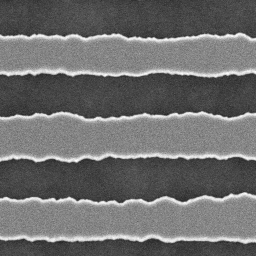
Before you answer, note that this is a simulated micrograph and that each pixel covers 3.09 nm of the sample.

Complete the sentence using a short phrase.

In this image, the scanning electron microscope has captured lines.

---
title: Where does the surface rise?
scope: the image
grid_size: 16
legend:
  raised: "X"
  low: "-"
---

----------------
----------------
XXXXXXXXXXXXXXXX
XXXXXXXXXXXXXXXX
XXXXXXXXXXXXXXXX
----------------
----------------
XXXXXXXXXXXXXXXX
XXXXXXXXXXXXXXXX
XXXXXXXXXXXXXXXX
----------------
----------------
XXXXX---X-X-XXXX
XXXXXXXXXXXXXXXX
XXXXXXXXXXXXXXXX
----------------